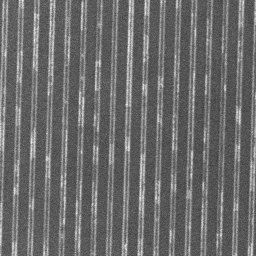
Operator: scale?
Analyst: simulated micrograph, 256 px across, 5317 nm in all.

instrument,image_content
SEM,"parallel lines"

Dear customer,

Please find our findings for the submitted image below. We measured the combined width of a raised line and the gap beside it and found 326 nm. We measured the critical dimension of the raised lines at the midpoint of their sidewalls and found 4.37 px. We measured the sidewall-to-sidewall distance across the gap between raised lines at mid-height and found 236 nanometres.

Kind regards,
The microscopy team